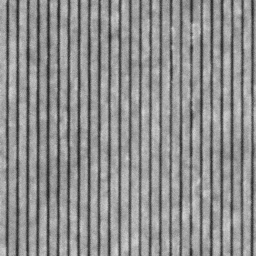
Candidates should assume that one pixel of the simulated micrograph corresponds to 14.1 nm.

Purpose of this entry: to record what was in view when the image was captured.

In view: parallel lines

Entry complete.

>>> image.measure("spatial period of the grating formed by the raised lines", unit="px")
10.2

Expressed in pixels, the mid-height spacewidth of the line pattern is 2.75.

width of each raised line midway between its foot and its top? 104 nm